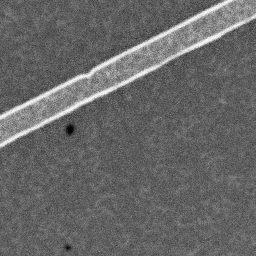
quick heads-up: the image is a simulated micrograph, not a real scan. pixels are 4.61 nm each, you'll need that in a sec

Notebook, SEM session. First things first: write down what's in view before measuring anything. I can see one or a few lines or trenches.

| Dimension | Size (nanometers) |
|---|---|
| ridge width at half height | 112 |